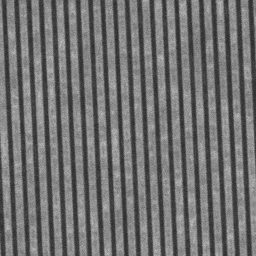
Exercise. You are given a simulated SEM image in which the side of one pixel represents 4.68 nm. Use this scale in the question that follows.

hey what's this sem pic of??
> parallel lines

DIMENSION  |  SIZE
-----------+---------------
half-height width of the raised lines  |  6.99 px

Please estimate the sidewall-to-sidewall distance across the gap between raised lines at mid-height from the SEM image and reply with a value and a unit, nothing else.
24.5 nm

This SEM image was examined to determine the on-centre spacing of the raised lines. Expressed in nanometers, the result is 57.5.